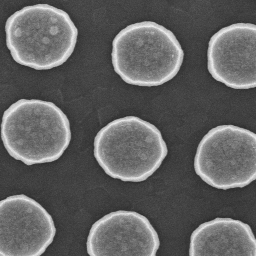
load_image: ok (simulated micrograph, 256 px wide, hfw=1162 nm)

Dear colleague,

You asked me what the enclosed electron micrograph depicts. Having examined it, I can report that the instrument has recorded raised bodies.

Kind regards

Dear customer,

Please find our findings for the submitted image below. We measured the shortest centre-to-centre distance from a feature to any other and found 95.4 px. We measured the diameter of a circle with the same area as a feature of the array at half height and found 0.293 micrometres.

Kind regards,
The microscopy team